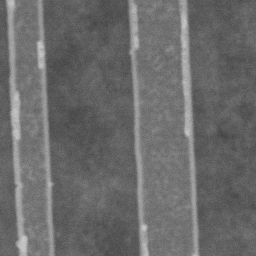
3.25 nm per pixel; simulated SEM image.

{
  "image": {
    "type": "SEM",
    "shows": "one or a few lines or trenches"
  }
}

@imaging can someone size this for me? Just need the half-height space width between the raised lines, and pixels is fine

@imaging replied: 89.9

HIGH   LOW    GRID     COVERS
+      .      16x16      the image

.++.....++++....
.++.....++++....
.++.....++++....
.++.....++++....
.++.....++++....
.++.....++++....
.++......+++....
.++......+++....
.++......+++....
.++......+++....
.++......+++....
.++......+++....
.++......+++....
.++......+++....
.++......+++....
.++......+++....